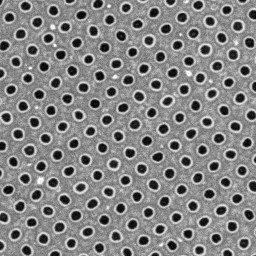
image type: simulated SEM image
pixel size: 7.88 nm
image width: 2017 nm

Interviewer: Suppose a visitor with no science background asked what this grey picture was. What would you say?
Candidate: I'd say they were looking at a regular array of holes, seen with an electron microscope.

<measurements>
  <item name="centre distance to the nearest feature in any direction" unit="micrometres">0.156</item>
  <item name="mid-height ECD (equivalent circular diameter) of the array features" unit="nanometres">79.1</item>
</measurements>